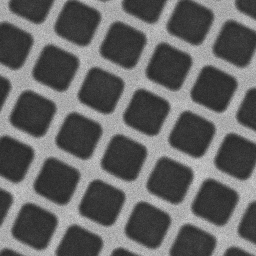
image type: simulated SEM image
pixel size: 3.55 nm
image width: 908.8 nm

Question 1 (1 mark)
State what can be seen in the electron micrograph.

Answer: a regular array of holes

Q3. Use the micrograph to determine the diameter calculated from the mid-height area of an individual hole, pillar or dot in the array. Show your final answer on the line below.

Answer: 150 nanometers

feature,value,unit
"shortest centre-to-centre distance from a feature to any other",50.3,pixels